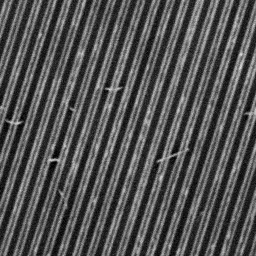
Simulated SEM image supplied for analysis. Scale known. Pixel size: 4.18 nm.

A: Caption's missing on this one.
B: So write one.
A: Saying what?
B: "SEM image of parallel lines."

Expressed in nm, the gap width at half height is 31.9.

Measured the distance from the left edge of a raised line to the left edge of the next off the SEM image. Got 58.8 nanometers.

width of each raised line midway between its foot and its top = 28.3 nm